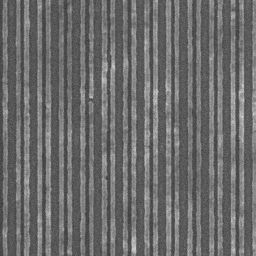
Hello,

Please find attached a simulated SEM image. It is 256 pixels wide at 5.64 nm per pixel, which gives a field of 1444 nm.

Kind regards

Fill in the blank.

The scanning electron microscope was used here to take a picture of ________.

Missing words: parallel lines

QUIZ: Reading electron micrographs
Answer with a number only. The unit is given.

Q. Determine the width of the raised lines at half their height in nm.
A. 21.1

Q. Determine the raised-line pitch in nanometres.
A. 60.5